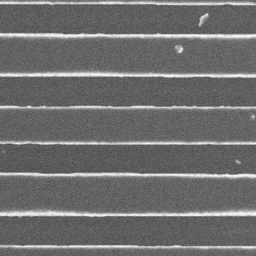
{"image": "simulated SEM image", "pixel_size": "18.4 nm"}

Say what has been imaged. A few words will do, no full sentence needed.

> lines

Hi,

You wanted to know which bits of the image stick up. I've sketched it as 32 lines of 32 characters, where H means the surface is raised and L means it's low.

LLLLLLLLLLLLLLLLLLLHHHHHHHHHHHHH
LLLLLLLLLLLLLLLLLLLLLLLLLLLLLLLL
LLLLLLLLLLLLLLLLLLLLLLLLLLLLLLLL
LLLLLLLLLLLLLLLLLLLLLLLLLLLLLLLL
HHHHHHHHHHHHHHHHHHHHHHHHHHHHHHHH
HHHHHHHHHHHHHHHHHHHHHHHHHHHHHHHH
HHHHHHHHHHHHHHHHHHHHHHHHHHHHHHHH
HHHHHHHHHHHHHHHHHHHHHHHHHHHHHHHH
HHHHHHHHHHHHHHHHHHHHHHHHHHHHHHHH
LLLLLLLLLLLLLLLLLLLLHHHHLLHHHHHH
LLLLLLLLLLLLLLLLLLLLLLLLLLLLLLLL
LLLLLLLLLLLLLLLLLLLLLLLLLLLLLLLL
LLLLLLLLLLLLLLLLLLLLLLLLLLLLLLLL
HHHHHHHHHHHHHHHHHHHHHHHHHHHHHHHH
HHHHHHHHHHHHHHHHHHHHHHHHHHHHHHHH
HHHHHHHHHHHHHHHHHHHHHHHHHHHHHHHH
HHHHHHHHHHHHHHHHHHHHHHHHHHHHHHHH
HHHHHHHHHHHHHHHHHHHHHHHHHHHHHHHH
LLLLLLLLLLLLLLLLLLLLLLLLLLLLLLLL
LLLLLLLLLLLLLLLLLLLLLLLLLLLLLLLL
LLLLLLLLLLLLLLLLLLLLLLLLLLLLLLLL
LLLLLLLLLLLLLLLLLLLLLLLLLLLLLLLL
HHHHHHHHHHHHHHHHHHHHHHHHHHHHHHHH
HHHHHHHHHHHHHHHHHHHHHHHHHHHHHHHH
HHHHHHHHHHHHHHHHHHHHHHHHHHHHHHHH
HHHHHHHHHHHHHHHHHHHHHHHHHHHHHHHH
HHHHHHHHHHHHHHHHHHHHHHHHHHHHHHHH
LLLLLLLLLLLLLLLLLLLLLLLLLLLLLLLL
LLLLLLLLLLLLLLLLLLLLLLLLLLLLLLLL
LLLLLLLLLLLLLLLLLLLLLLLLLLLLLLLL
LLLLLLLLLLLLLLLLLLLLLLLLLLLLLLLL
HHHHHHHHHHHHHHHHHHHHHHHHHHHHHHHH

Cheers